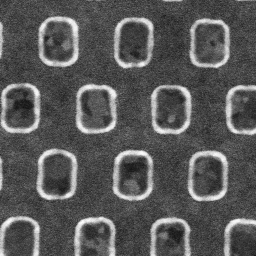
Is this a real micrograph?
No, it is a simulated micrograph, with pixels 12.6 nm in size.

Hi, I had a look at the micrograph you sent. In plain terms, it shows a regular array of raised bodies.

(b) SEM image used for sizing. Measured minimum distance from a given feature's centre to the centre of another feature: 74.9 px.